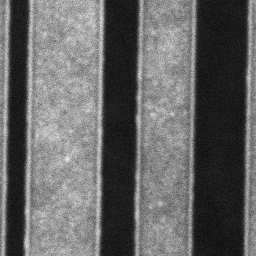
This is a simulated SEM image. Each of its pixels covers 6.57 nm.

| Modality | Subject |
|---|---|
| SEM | one or a few lines or trenches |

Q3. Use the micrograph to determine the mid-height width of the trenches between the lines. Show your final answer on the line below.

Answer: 399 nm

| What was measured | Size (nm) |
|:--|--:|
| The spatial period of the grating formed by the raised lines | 666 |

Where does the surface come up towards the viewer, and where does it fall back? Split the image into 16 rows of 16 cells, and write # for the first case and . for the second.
##....###...####
##....###...####
##....###...####
##....###...####
##....###...####
##....###...####
##....###...####
##....###...####
##....###...####
##....###...####
##....###...###.
##....###...###.
##....###...###.
##....###...###.
##....###...###.
##....###...###.